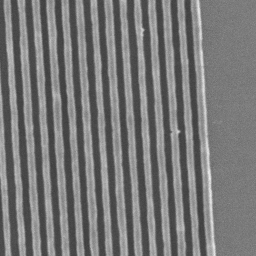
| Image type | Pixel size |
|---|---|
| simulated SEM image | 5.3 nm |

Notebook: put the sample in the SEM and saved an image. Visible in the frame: parallel lines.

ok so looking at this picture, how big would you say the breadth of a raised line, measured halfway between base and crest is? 35.7 nanometres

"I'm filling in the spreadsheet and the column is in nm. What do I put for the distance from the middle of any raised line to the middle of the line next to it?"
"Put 76.6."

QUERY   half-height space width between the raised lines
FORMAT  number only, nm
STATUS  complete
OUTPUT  40.3